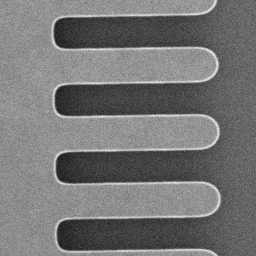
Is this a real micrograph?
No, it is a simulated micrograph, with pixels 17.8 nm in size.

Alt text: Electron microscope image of groups of lines, slits or small figures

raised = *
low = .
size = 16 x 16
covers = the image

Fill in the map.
*************...
***.............
***.............
*************...
*************...
****............
***.............
*************...
**************..
****............
***.............
*************...
**************..
*************...
****............
****............